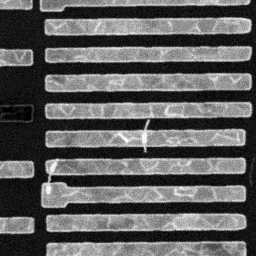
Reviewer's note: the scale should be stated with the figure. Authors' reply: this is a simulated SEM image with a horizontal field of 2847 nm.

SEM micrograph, wiring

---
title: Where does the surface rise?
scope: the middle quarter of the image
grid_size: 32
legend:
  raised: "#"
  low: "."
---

................................
................................
................................
################################
################################
################################
####################....#######.
................................
................................
................................
################################
################################
################################
###.#....###....................
................................
................................
....................#...........
################################
################################
################################
#########################.###...
................................
................................
................................
################################
################################
################################
................................
................................
................................
#...............................
################################